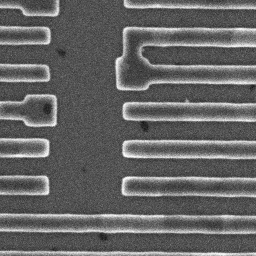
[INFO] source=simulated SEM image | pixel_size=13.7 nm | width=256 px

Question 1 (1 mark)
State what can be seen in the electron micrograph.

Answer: wiring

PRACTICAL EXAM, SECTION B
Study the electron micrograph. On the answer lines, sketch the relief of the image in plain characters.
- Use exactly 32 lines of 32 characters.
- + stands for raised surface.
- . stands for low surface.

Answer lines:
+++++++.........++++++++++++++++
...++++.........................
................................
++++++..........++..............
++++++.........+++++++++++++++++
.++.............++++++++++++++++
...............+++..............
...............+++..............
++++++.........+++++++++++++++++
++++++.........+++++++++++++++++
...............++++.............
................................
...++++.........................
+++++++........+++++++++++++++++
+++++++........+++++++++++++++++
...++++.........................
................................
++++++..........................
++++++.........+++++++++++++++++
+..+++..........++++++++++++++++
................................
................................
++++++..........++++++++++++++++
++++++.........+++++++++++++++++
..........................++++++
................................
................................
++++++++++++++++++++++++++++++++
++++++++++++++++++++++++++++++++
................................
................................
+++.+++.........................